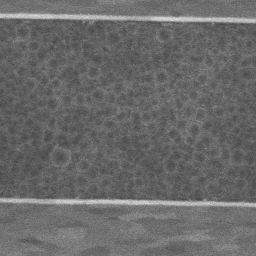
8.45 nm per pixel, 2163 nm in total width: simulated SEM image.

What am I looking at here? one or a few lines or trenches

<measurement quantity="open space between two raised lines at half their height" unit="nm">1550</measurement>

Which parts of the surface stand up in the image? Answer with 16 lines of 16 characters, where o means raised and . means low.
oooooooooooooooo
................
................
................
................
................
................
................
................
................
................
................
................
oooooooooooooooo
oooooooooooooooo
oooooooooooooooo